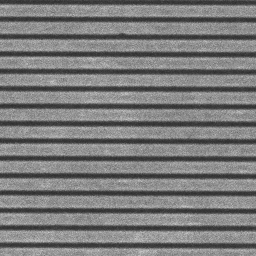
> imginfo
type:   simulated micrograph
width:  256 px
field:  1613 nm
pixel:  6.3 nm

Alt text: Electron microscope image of parallel lines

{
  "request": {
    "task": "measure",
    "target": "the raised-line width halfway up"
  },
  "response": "74.8 nm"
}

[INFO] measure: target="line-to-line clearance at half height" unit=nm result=34.7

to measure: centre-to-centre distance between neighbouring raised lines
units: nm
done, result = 110